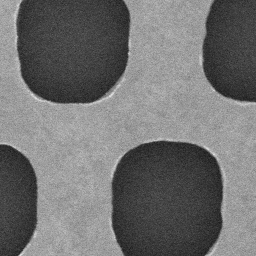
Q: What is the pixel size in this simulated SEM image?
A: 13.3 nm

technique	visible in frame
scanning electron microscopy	holes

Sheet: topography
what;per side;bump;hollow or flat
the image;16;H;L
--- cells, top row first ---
HLLLLLLLHHHHHLLL
HLLLLLLLHHHHHLLL
HLLLLLLLHHHHHLLL
HLLLLLLLHHHHHLLL
HLLLLLLLHHHHHLLL
HHLLLLLHHHHHHLLL
HHHHHHHHHHHHHHHH
HHHHHHHHHHHHHHHH
HHHHHHHHHHHHHHHH
LHHHHHHHLLLLLHHH
LLHHHHHLLLLLLLHH
LLHHHHHLLLLLLLHH
LLHHHHHLLLLLLLHH
LLHHHHHLLLLLLLHH
LLHHHHHLLLLLLLHH
LLHHHHHHLLLLLHHH